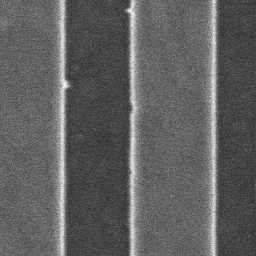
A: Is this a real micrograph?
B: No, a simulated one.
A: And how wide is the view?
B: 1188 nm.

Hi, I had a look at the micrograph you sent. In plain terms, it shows one or a few lines or trenches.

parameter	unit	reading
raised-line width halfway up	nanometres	385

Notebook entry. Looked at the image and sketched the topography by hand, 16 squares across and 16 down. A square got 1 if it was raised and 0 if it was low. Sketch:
1111000011111000
1111000011111000
1111000011111000
1111000011111000
1111000011111000
1111000011111000
1111000011111000
1111000011111000
1111000011111000
1111000011111000
1111000011111000
1111000011111000
1111000011111000
1111000011111000
1111000011111000
1111000011111000